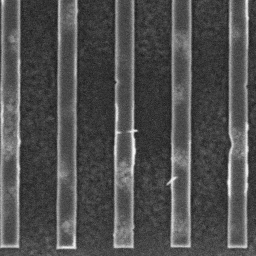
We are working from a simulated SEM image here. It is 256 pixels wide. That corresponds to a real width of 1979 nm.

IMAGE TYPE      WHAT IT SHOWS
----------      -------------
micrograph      parallel lines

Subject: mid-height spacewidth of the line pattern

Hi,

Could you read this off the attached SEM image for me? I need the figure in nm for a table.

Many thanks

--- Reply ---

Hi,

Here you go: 295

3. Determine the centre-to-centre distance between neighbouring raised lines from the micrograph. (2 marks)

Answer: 440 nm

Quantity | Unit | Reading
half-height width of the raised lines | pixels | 19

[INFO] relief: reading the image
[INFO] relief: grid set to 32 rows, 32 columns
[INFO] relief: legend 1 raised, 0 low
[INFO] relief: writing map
11000001110000011000001100000110
11000001110000011000001100000110
11000001110000111000001100000110
11000001110000111000001100000110
11000001110000111000001100000110
11000001110000111000001100000110
11000001110000111000001100000110
11000001110000111000001100000110
11000001110000111000001100000110
11000001110000111000011100000110
11000001110000111000011100000110
11000001110000111000001100000110
11000001110000111000001100000110
11000001100000111000001100000110
11000001110000111000001100000110
11000001110000111000001100000110
11000001110000111000011100000110
11000001110000111000011100000110
11000001100000111000011100000110
11000001100000111000011100000110
11000001110000111000001100000110
11000001110000111000001100000110
11000001110000111000011100001110
11000001110000111000011100001110
11000001100000111000001100000110
11000001100000111000001100000110
11000001100000111000001100000110
11000001100000111000001100000110
11000001100000111000011100000110
11000001100000111000011100000110
11000001100000111000011100000110
00000000000000000000000000000000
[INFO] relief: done